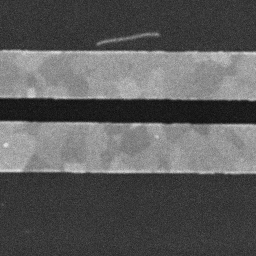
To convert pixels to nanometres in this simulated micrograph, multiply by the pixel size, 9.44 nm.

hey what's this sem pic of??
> lines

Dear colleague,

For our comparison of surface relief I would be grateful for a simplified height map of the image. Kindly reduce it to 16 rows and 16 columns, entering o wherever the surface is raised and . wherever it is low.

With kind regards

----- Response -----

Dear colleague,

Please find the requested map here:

................
................
................
oooooooooooooooo
oooooooooooooooo
oooooooooooooooo
................
................
oooooooooooooooo
oooooooooooooooo
oooooooooooooooo
................
................
................
................
................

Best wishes